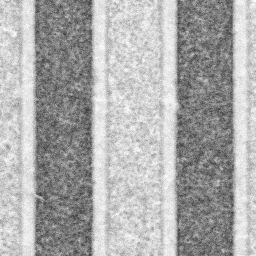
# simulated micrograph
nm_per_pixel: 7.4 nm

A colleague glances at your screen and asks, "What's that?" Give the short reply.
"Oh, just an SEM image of one or a few lines or trenches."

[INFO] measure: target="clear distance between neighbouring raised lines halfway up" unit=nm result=540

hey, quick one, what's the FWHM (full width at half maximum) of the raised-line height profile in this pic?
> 504 nanometers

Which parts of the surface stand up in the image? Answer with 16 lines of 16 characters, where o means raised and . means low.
oo....oooo.....o
oo....ooooo....o
oo....ooooo....o
oo....ooooo....o
oo....oooo.....o
oo....oooo.....o
oo....ooooo....o
oo....oooo.....o
oo....oooo.....o
oo....oooo.....o
oo....ooooo....o
oo....oooo.....o
oo....oooo.....o
oo....oooo.....o
oo....oooo.....o
oo....ooooo....o